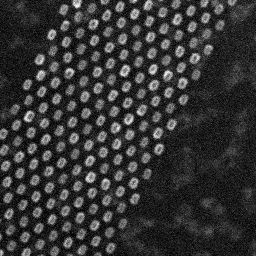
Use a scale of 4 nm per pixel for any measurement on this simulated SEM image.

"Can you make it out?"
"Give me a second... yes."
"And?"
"a regular array of raised bodies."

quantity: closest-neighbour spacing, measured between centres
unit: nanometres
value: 63.2